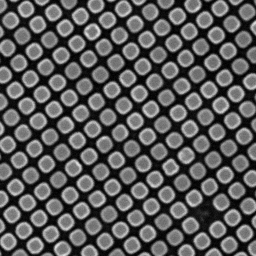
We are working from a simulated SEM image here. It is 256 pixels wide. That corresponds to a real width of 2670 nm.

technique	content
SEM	a regular array of raised bodies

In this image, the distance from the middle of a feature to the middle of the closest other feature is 200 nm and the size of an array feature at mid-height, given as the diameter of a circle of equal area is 15.6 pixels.